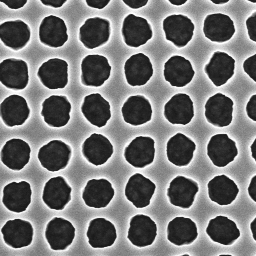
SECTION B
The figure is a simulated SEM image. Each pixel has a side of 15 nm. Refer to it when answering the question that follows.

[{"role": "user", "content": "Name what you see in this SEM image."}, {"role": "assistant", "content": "a regular array of holes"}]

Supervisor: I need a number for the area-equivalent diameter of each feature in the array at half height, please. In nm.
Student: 460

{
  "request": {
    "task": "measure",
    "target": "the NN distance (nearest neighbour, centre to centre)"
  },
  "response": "585 nm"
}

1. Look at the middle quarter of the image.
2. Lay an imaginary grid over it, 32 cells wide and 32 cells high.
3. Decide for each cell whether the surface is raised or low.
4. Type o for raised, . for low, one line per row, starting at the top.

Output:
.ooo........ooo.......ooo.......
.ooo........ooo.......ooo.......
.ooo........ooo.......ooo.......
.ooo.......ooooo......ooo.......
.oooo.....oooooo.....ooooo.....o
ooooooo..oooooooooooooooooo...oo
oooooooooooooooooooooooooooooooo
ooooooo..ooooooooooooooooooo...o
ooooo.....oooooo....ooooooo.....
.oooo......oooo......ooooo......
..ooo......oooo.......ooo.......
..oo.......ooo........ooo.......
.oooo.......oo........ooo.......
.ooooo......ooo.......ooo.......
.oooooo....oooo......ooooo.....o
oooooooo..oooooooooooooooooooooo
oooooooooooooooooooooooooooooooo
ooooooo.oooooooooooooooooooo.ooo
oooooo.....ooooooo....ooooo....o
ooooo......oooooo......ooo......
.oooo.......oooo.......ooo......
..ooo.......ooo........ooo......
..ooo.......ooo........ooo......
.ooooo.....oooo.......oooo......
.oooooo...oooooo......ooooo....o
ooooooooooooooooo...oooooooo..oo
oooooooooooooooooooooooooooooooo
oooooooooooooooooo.ooooooooooooo
oooooooooooooooo.....ooooooo..oo
oooooo.....ooooo......ooooo.....
.oooo.......oooo.......ooo......
..ooo.......ooo........ooo......